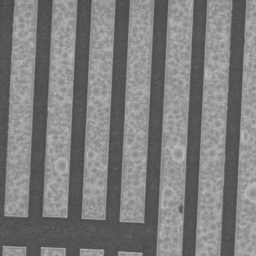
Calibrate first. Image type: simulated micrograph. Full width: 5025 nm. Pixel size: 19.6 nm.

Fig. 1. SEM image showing parallel lines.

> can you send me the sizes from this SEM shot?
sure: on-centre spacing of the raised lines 0.75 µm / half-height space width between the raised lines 284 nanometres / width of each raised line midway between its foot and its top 480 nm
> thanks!